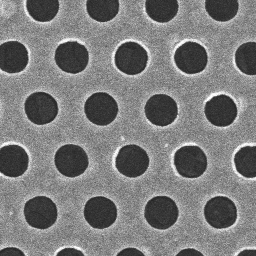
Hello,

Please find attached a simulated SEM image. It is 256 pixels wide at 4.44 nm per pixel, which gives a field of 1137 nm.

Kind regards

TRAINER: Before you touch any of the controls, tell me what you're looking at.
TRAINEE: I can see a regular array of holes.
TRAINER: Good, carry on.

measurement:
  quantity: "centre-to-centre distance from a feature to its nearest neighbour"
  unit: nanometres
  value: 262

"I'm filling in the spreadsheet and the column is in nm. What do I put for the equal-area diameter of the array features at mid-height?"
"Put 148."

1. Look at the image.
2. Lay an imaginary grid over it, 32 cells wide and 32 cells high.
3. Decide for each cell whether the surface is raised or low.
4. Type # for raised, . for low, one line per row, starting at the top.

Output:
###....####....###....####....##
####...####....###....####....##
####..######..#####..######..###
################################
################################
...#####..#####..######..#####..
...####....###....####....####..
...####....###....####....###...
...####....####...####....####..
################################
################################
################################
###....####...#####...####...###
###....####....###....####....##
###....####....###....####....##
####..######..#####..######..###
################################
################################
...####...#####...#####..#####..
....###....####....###....###...
....###....###.....###....###...
...####...#####...####...#####..
################################
################################
###########################.####
###....####...####....####...###
###....###.....###....####....##
###....####...####....####...###
####..######.######..######.####
################################
################################
...####...#####...####...#####..